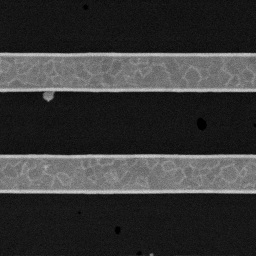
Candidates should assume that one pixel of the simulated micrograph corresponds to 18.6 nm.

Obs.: wiring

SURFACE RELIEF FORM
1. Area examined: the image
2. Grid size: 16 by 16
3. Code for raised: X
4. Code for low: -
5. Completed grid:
----------------
----------------
----------------
XXXXXXXXXXXXXXXX
XXXXXXXXXXXXXXXX
XXXXXXXXXXXXXXXX
----------------
----------------
----------------
----------------
XXXXXXXXXXXXXXXX
XXXXXXXXXXXXXXXX
----------------
----------------
----------------
----------------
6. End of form